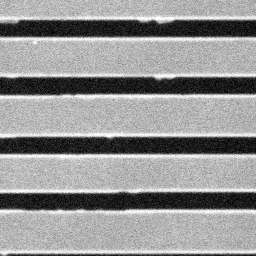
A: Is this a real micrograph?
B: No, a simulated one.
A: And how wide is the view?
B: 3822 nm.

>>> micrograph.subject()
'lines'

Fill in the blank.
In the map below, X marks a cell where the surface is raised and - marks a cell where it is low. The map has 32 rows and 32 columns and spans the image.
XXXXXXXXXXXXXXXXXXXXXXXXXXXXXXXX
XXXXXXXXXXXXXXXXXXXXXXXXXXXXXXXX
--------------------------------
--------------------------------
--------------------------------
XXXXXXXXXXXXXXXXXXXXXXXXXXXXXXXX
XXXXXXXXXXXXXXXXXXXXXXXXXXXXXXXX
XXXXXXXXXXXXXXXXXXXXXXXXXXXXXXXX
XXXXXXXXXXXXXXXXXXXXXXXXXXXXXXXX
--------------------------------
--------------------------------
--------------------------------
XXXXXXXXXXXXXXXXXXXXXXXXXXXXXXXX
XXXXXXXXXXXXXXXXXXXXXXXXXXXXXXXX
XXXXXXXXXXXXXXXXXXXXXXXXXXXXXXXX
XXXXXXXXXXXXXXXXXXXXXXXXXXXXXXXX
XXXXXXXXXXXXXXXXXXXXXXXXXXXXXXXX
--------------------------------
--------------------------------
XXXXXXXXX-XXXXXXXXXXXXXXXXXXXXXX
XXXXXXXXXXXXXXXXXXXXXXXXXXXXXXXX
XXXXXXXXXXXXXXXXXXXXXXXXXXXXXXXX
XXXXXXXXXXXXXXXXXXXXXXXXXXXXXXXX
XXXXXXXXXXXXXXXXXXXXXXXXXXXXXXXX
--------------------------------
--------------------------------
XXXXXXXXXXXXXXXXXXXXXXXXXXXXXXXX
XXXXXXXXXXXXXXXXXXXXXXXXXXXXXXXX
XXXXXXXXXXXXXXXXXXXXXXXXXXXXXXXX
XXXXXXXXXXXXXXXXXXXXXXXXXXXXXXXX
XXXXXXXXXXXXXXXXXXXXXXXXXXXXXXXX
XXXXXXXXXXXXXXXXXXXXXXXXXXXXXXXX